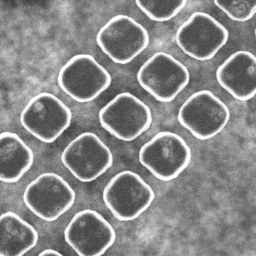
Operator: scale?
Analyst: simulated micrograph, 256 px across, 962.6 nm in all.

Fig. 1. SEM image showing a regular array of raised bodies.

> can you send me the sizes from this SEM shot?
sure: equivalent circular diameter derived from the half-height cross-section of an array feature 172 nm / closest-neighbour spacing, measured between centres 207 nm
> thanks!